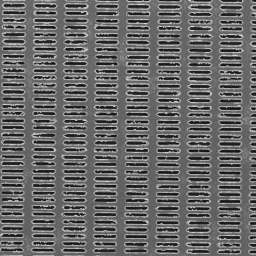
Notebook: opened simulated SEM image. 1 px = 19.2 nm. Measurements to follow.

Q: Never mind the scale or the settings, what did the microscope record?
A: a regular array of holes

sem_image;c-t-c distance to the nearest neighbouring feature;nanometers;134